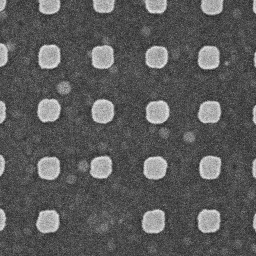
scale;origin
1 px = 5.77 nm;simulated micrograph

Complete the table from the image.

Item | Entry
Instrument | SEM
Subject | a regular array of raised bodies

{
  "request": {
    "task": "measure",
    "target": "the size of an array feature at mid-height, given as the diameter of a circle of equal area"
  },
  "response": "132 nanometres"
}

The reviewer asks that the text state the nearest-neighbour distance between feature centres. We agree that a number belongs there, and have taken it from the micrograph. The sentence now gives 307 nm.